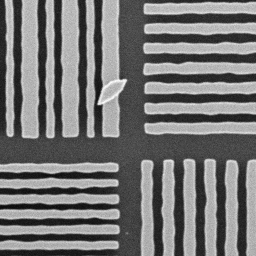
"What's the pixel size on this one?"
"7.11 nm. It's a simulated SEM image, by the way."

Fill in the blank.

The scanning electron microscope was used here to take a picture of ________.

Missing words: groups of lines, slits or small figures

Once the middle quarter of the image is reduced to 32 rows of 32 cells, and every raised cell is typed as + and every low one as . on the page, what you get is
++++..++..++++......++++++++++++
++++..++.+++++......++++++++++++
++++..++.+++++......++++.....+++
++++..++.+++++..................
++++..+...+++++.................
++++..++..+++++.....++++++++++++
++++..++.++++++.....++++++++++++
++++..++.+++++..................
++++..++.++++...................
++++..+++++++...................
++++..+...++++......++++++++++++
++++..+...++++......++++++++++++
++++..+...++++..................
++++..+...++++..................
++++..+...++++..................
++++..+...+++.......++++++++++++
++++..++..++++......++++++++++++
++++..++..++++..................
................................
................................
................................
................................
................................
................................
....................++...++...++
+++++++++++++......+++...++...++
+++++++++++++......+++...++...++
....................++...++...++
....................++...+++..++
+++++++++++++......+++...+++..++
+++++++++++........+++...+++..++
...................+++...++...++